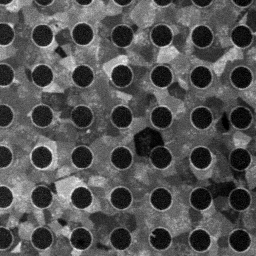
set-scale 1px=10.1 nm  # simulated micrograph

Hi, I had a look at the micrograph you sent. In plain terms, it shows a regular array of holes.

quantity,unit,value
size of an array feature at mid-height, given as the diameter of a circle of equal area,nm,224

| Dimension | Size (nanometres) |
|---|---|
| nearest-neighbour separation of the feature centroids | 398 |